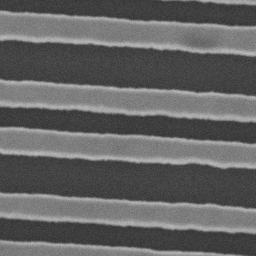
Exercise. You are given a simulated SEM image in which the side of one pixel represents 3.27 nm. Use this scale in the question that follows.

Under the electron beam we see lines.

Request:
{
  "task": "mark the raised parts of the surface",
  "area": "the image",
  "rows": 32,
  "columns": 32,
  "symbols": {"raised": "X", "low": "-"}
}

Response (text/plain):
-------------------------------X
X-------------------------------
XXXXXXXXXXXXXXXX----------------
XXXXXXXXXXXXXXXXXXXXXXXXXXXXXXXX
XXXXXXXXXXXXXXXXXXXXXXXXXXXXXXXX
------------XXXXXXXXXXXXXXXXXXXX
-------------------------XXXXXXX
--------------------------------
--------------------------------
--------------------------------
XXXXXXXX------------------------
XXXXXXXXXXXXXXXXXXXXXXXX--------
XXXXXXXXXXXXXXXXXXXXXXXXXXXXXXXX
------XXXXXXXXXXXXXXXXXXXXXXXXXX
----------------------XXXXXXXXXX
--------------------------------
XXXXXXXX------------------------
XXXXXXXXXXXXXXXXXXXXXXXX--------
XXXXXXXXXXXXXXXXXXXXXXXXXXXXXXXX
-------XXXXXXXXXXXXXXXXXXXXXXXXX
--------------------------XXXXXX
--------------------------------
--------------------------------
--------------------------------
XXXXXXX-------------------------
XXXXXXXXXXXXXXXXXXXXXXXX--------
XXXXXXXXXXXXXXXXXXXXXXXXXXXXXXXX
-----XXXXXXXXXXXXXXXXXXXXXXXXXXX
---------------------XXXXXXXXXXX
--------------------------------
XXXXXXXXXX----------------------
XXXXXXXXXXXXXXXXXXXXXXX---------